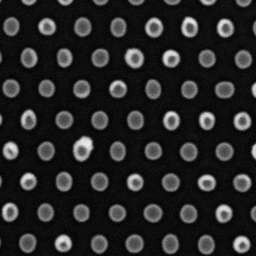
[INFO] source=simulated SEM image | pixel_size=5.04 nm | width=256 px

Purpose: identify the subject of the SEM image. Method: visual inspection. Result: a regular array of raised bodies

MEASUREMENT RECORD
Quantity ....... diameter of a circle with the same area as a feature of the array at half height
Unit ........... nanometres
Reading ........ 81.9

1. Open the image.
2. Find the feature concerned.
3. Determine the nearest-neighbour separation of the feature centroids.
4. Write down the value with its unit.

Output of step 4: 178 nm